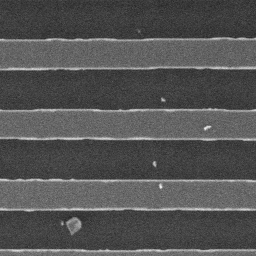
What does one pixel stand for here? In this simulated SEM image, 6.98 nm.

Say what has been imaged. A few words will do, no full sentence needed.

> lines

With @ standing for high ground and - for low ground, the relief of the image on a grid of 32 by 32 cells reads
--------------------------------
--------------------------------
--------------------------------
--------------------------------
--------------------------------
@@@@@@@@@@@@@@@@@@@@@@@@@@@@@@@@
@@@@@@@@@@@@@@@@@@@@@@@@@@@@@@@@
@@@@@@@@@@@@@@@@@@@@@@@@@@@@@@@@
@@@@@@@@@@@@@@@@@@@@----@-@@@@@@
--------------------------------
--------------------------------
--------------------------------
--------------------------------
--------------------------------
@@@@@@@@@@@@@@@@@@@@@@@@@@@@@@@@
@@@@@@@@@@@@@@@@@@@@@@@@@@@@@@@@
@@@@@@@@@@@@@@@@@@@@@@@@@@@@@@@@
-------------------------@@---@@
--------------------------------
--------------------------------
--------------------------------
--------------------------------
@-@@@@@@@@----------------------
@@@@@@@@@@@@@@@@@@@@@@@@@@@@@@@@
@@@@@@@@@@@@@@@@@@@@@@@@@@@@@@@@
@@@@@@@@@@@@@@@@@@@@@@@@@@@@@@@@
--------------------------------
--------------------------------
--------------------------------
--------------------------------
--------------------------------
@@@@@@@@@@@@@@@@@@@@@@@@@@@@@@@@